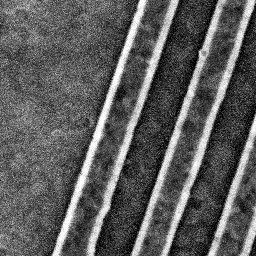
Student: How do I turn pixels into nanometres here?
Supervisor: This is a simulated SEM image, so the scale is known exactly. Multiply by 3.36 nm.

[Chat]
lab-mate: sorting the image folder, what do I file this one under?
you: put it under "one or a few lines or trenches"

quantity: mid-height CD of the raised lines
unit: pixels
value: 30.7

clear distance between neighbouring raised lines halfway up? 43.3 pixels